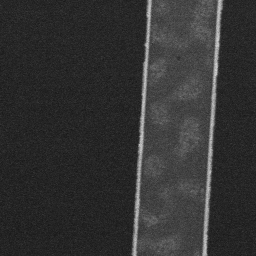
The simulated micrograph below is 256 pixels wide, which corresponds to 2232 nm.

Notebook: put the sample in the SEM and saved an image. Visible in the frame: one or a few lines or trenches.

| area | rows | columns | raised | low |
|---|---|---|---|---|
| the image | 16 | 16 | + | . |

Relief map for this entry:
+++++++++.....++
+++++++++.....++
+++++++++.....++
+++++++++....+++
+++++++++....+++
+++++++++....+++
+++++++++....+++
+++++++++....+++
+++++++++....+++
+++++++++....+++
+++++++++....+++
+++++++++....+++
+++++++++....+++
+++++++++....+++
+++++++++....+++
++++++++.....+++